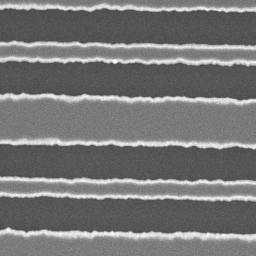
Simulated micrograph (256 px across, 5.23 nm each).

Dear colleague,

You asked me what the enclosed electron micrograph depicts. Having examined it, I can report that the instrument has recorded lines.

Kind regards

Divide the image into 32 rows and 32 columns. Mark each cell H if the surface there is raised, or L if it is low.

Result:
HHHHHHHHHHHHHHHHHHHHHHHHHHHHHHHH
LLLLLLLLLLLLLLLLLLLLLLLLLLLLLLLL
LLLLLLLLLLLLLLLLLLLLLLLLLLLLLLLL
LLLLLLLLLLLLLLLLLLLLLLLLLLLLLLLL
LLLLLLLLLLLLLLLLLLLLLLLLLLLLLLLL
HHHHHHHHHHHHHLLLLLLLLLLLLLLLLLLL
HHHHHHHHHHHHHHHHHHHHHHHHHHHHHHHH
HLHHHHHHHHHHHHHHHHHHHHHHHHHHHHHH
LLLLLLLLLLLLLLLLLLLLLLLLLLLLLLLL
LLLLLLLLLLLLLLLLLLLLLLLLLLLLLLLL
LLLLLLLLLLLLLLLLLLLLLLLLLLLLLLLL
LLLLLLLLLLLLLLLLLLLLLLLLLLLLLLLL
HHHHHHHHHHHHHHHHHHHHHHHHHHHHHHLH
HHHHHHHHHHHHHHHHHHHHHHHHHHHHHHHH
HHHHHHHHHHHHHHHHHHHHHHHHHHHHHHHH
HHHHHHHHHHHHHHHHHHHHHHHHHHHHHHHH
HHHHHHHHHHHHHHHHHHHHHHHHHHHHHHHH
HHHHHHHHHHHHHHHHHHHHHHHHHHHHHHHH
LLLLLLLLLLLLLLLLLLLLLLLLLLLHLLLH
LLLLLLLLLLLLLLLLLLLLLLLLLLLLLLLL
LLLLLLLLLLLLLLLLLLLLLLLLLLLLLLLL
LLLLLLLLLLLLLLLLLLLLLLLLLLLLLLLL
HHHHHHHHLHHHLLHHHLLLLLLLLLLLLLLL
HHHHHHHHHHHHHHHHHHHHHHHHHHHHHHHH
LHHHLLLHHHHHHHHHHHHHHHHHHHHHHHHH
LLLLLLLLLLLLLLLLLLLLLLLLLLLLLLLL
LLLLLLLLLLLLLLLLLLLLLLLLLLLLLLLL
LLLLLLLLLLLLLLLLLLLLLLLLLLLLLLLL
LLLLLLLLLLLLLLLLLLLLLLLLLLLLLLLL
HHHHHHHHHHHHHHHHHHHHHHHHHHHHHHHH
HHHHHHHHHHHHHHHHHHHHHHHHHHHHHHHH
HHHHHHHHHHHHHHHHHHHHHHHHHHHHHHHH